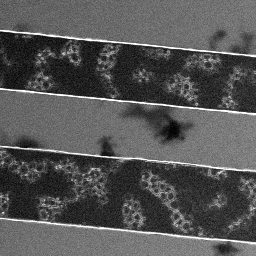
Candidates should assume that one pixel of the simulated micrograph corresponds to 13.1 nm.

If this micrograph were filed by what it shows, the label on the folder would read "one or a few lines or trenches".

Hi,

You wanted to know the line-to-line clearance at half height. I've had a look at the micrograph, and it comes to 0.74 micrometres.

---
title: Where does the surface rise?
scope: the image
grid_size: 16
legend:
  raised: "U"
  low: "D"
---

DDDDDDDDDDDDDDDD
DDDDDDDDDDDDDDDD
UUUUUUDDDDDDDDDD
UUUUUUUUUUUUUUUU
UUUUUUUUUUUUUUUU
UUUUUUUUUUUUUUUU
DDDDDDDDDDUUUUUU
DDDDDDDDDDDDDDDD
DDDDDDDDDDDDDDDD
UUUUDDDDDDDDDDDD
UUUUUUUUUUUUUUDD
UUUUUUUUUUUUUUUU
UUUUUUUUUUUUUUUU
UUUUUUUUUUUUUUUU
DDDDDDDDDUUUUUUU
DDDDDDDDDDDDDDDD